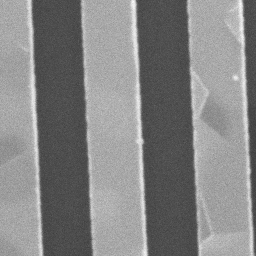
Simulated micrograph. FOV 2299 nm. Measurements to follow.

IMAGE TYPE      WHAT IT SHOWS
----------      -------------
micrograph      lines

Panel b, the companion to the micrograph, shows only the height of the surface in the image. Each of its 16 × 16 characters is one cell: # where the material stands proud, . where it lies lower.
##...###....###.
##...###....###.
##...####...###.
##...####...###.
##...####...###.
##...####...###.
##...####...###.
##...####...###.
##...####...####
##....###...####
##....###...####
##....###...####
##....###...####
###...###...####
###...###...####
###...###...####